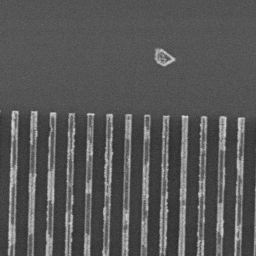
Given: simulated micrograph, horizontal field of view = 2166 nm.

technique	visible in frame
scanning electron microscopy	parallel lines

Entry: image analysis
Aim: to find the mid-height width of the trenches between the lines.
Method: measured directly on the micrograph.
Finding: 118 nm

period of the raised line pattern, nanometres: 160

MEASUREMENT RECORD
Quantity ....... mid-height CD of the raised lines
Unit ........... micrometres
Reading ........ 0.0444